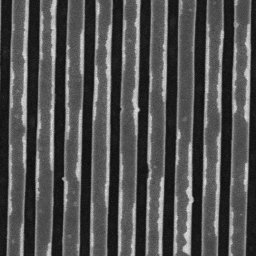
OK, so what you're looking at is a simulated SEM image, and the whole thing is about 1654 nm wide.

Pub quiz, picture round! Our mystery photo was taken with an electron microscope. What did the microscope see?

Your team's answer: parallel lines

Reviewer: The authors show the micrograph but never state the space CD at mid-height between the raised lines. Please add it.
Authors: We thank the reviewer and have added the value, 75.1 nanometres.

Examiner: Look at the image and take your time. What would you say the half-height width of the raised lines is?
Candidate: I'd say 16.4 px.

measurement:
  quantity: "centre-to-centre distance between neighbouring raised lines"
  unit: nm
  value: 180